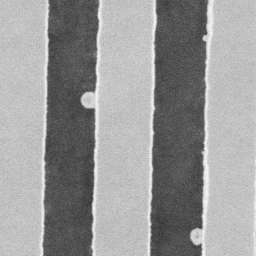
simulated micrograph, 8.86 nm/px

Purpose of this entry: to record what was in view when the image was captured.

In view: lines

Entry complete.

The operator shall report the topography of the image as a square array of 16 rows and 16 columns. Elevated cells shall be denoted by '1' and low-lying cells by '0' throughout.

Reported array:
1110001111000111
1110001111000111
1110001111000111
1110001111000111
1110001111000111
1110001111000111
1110001111000111
1110001111000111
1110001111000111
1110001111000111
1110001111000111
1110001110000111
1110001110000111
1110001110000111
1110001110000111
1110001110000111